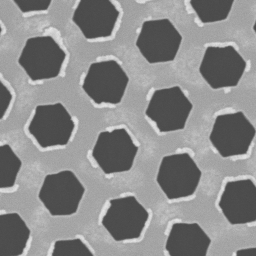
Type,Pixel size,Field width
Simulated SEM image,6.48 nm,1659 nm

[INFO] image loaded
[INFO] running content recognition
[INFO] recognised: a regular array of holes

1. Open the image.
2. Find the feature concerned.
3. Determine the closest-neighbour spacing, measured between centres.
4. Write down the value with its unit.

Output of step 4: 0.439 µm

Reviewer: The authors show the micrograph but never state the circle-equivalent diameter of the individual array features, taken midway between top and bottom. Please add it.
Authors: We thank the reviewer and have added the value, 43.5 pixels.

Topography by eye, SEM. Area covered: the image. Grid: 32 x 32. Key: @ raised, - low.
@@----@@@@----@@@@@@@@@@-----@@@
@@@@@@@@@------@@@@@@@@@-----@@@
@@@@@@@@@------@@@@@-@@@@---@@@@
@@@@@@@@@@----@@@@----@@@@@@@@@@
@@@@@@@@@@@--@@@@------@@@@@@@@@
@@@----@@@@@@@@@@-----@@@@@@@@@@
@@@-----@@@@@@@@@@----@@@@----@@
@@------@@@@@@@@@@---@@@@-----@@
@@@-----@@@----@@@@@@@@@@------@
@@@@---@@@@-----@@@@@@@@@-----@@
@@@@@@@@@@------@@@@@@@@@@----@@
-@@@@@@@@@@-----@@@----@@@@@@@@@
-@@@@@@@@@@@---@@@@-----@@@@@@@@
-@@@@---@@@@@@@@@@------@@@@@@@@
@@@@-----@@@@@@@@@------@@@----@
@@@@-----@@@@@@@@@@----@@@@----@
@@@@-----@@@@---@@@@@@@@@@------
@@@@@----@@@----@@@@@@@@@@------
-@@@@@@@@@@@-----@@@@@@@@@@----@
--@@@@@@@@@@-----@@@@---@@@@-@@@
---@@@@@@@@@-----@@@----@@@@@@@@
--@@@@@--@@@@--@@@@@-----@@@@@@@
--@@@@----@@@@@@@@@@-----@@@@@-@
@@@@@-----@@@@@@@@@@----@@@@----
@@@@@-----@@@@@@@@@@@---@@@@----
@@@@@-----@@@@----@@@@@@@@@-----
@@@@@@---@@@@-----@@@@@@@@@@----
---@@@@@@@@@@-----@@@@@@@@@@@---
---@@@@@@@@@@-----@@@----@@@@@@@
----@@@@@@@@@@---@@@@-----@@@@@@
---@@@@----@@@@@@@@@@-----@@@@@@
---@@@@----@@@@@@@@@@-----@@@@--